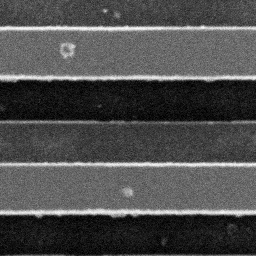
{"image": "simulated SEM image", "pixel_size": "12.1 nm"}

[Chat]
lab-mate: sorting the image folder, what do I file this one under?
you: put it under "lines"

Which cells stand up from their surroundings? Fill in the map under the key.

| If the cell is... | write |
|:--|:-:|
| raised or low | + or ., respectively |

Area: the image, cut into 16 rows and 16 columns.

++++++++++++++++
++++++++++++++++
++++++++++++++++
++++++++++++++++
++++++++++++++++
................
................
................
++++++++++++++++
++++++++++++++++
++++++++++++++++
++++++++++++++++
++++++++++++++++
.......+........
................
................